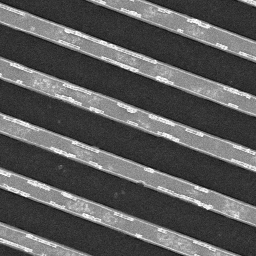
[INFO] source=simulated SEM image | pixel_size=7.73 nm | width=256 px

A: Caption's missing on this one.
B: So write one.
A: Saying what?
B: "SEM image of parallel lines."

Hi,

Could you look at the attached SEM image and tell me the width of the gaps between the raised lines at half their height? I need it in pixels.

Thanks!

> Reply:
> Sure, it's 33.9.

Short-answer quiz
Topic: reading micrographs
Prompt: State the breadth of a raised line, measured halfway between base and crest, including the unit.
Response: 134 nm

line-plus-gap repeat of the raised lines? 399 nanometers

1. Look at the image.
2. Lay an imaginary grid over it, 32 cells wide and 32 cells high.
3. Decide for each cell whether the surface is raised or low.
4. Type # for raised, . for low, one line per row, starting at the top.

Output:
.............######............#
###............#######..........
######............#######.......
..######.............######.....
.....######............#######..
........######............######
..........#######............###
#............######.............
###............#######..........
######............######........
..#######............#######....
.....#######............######..
........######............######
...........######............###
#............######.............
####............######..........
######.............######.......
...######.............######....
......######............#######.
........#######............#####
...........######.............##
#.............######............
####............#######.........
#######............######.......
...######.............######....
......######.............######.
.........######............#####
...........######.............##
##............######............
####.............######.........
.######............#######......
...#######............######....